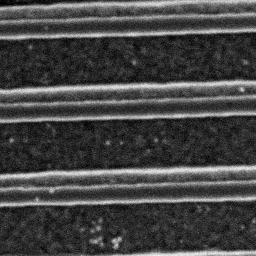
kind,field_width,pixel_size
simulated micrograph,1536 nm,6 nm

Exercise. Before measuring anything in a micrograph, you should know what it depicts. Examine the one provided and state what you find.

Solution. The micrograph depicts lines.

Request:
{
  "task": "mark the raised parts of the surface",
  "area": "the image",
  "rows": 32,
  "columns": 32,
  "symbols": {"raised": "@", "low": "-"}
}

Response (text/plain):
------------------@@@@@@@@@@@@@@
@@@@@@@@@@@@@@@@@@@@@@@@@@@@@@@@
@@@@@@@@@@@@@@@@@@@@@@@@@@@@@@@@
@@@@@@@@@@@@@@@@@@@@@@@@@@@@@@@@
@@@@@@@@@-----------------------
--------------------------------
--------------------------------
--------------------------------
--------------------------------
--------------------------------
---------------------------@@@@@
@@@@@@@@@@@@@@@@@@@@@@@@@@@@@@@@
@@@@@@@@@@@@@@@@@@@@@@@@@@@@@@@@
@@@@@@@@@@@@@@@@@@@@@@@@@@@@@@@@
@@@@@@@@@@@@@@@@@@@@@@@@--------
--------------------------------
--------------------------------
--------------------------------
--------------------------------
--------------------------------
--------------------------------
---------------@@----@@@@@@@@@@@
@@@@@@@@@@@@@@@@@@@@@@@@@@@@@@@@
@@@@@@@@@@@@@@@@@@@@@@@@@@@@@@@@
@@@@@@@@@@@@@@@@@@@@@@@@@@@@@@@@
@@@@@---------------------------
--------------------------------
--------------------------------
--------------------------------
--------------------------------
--------------------------------
--------------------------------